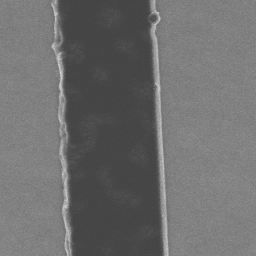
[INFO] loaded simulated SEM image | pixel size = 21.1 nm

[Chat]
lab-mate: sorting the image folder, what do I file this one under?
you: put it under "one or a few lines or trenches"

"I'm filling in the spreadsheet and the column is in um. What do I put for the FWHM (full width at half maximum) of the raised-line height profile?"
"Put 2.06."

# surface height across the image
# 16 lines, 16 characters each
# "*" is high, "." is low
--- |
...*******......
....******......
....******......
....******......
....******......
....******......
....******......
....******......
....******......
....******......
....******......
....******......
....******......
....******......
....******......
....******......